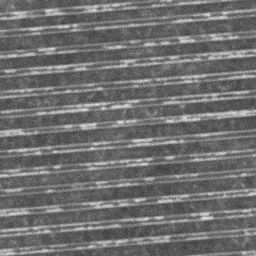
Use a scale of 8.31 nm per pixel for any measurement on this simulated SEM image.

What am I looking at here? parallel lines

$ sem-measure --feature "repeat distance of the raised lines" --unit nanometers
163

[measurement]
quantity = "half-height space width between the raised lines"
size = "107 nanometers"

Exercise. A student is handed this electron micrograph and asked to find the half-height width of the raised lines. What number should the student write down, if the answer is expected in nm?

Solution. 56.9